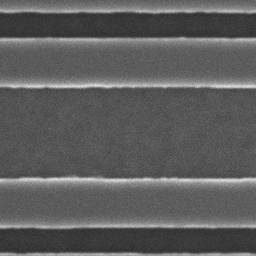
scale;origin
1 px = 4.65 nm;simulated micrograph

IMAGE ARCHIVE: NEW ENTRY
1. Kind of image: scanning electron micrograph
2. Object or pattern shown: lines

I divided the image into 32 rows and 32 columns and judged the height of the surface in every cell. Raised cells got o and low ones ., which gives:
oooooooooooooooooooooooooooooooo
ooo.ooooooooooo..ooooooo.ooooooo
................................
................................
................................
oooooooooooooooooooooooooooooooo
oooooooooooooooooooooooooooooooo
oooooooooooooooooooooooooooooooo
oooooooooooooooooooooooooooooooo
oooooooooooooooooooooooooooooooo
oooooooooooooooooooooooooooooooo
................................
................................
................................
................................
................................
................................
................................
................................
................................
................................
................................
oooooooooooooooooooooooooooooooo
oooooooooooooooooooooooooooooooo
oooooooooooooooooooooooooooooooo
oooooooooooooooooooooooooooooooo
oooooooooooooooooooooooooooooooo
oooooooooooooooooooooooooooooooo
................................
................................
................................
................................